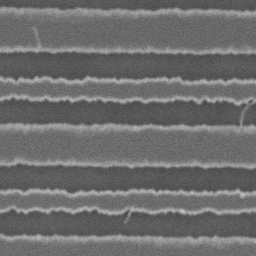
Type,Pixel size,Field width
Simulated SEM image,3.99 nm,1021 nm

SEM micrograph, lines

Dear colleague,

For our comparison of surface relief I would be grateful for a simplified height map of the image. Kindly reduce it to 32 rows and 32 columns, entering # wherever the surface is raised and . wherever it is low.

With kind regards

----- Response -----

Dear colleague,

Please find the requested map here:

................................
########.#######.#############..
################################
################################
################################
################################
............##......############
................................
................................
................................
################################
################################
......#..#.#.########...########
................................
................................
................................
################################
################################
################################
################################
##.#############################
................................
................................
................................
################################
################################
#..#.#...#..####..##..###..#####
................................
................................
................................
################################
################################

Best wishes